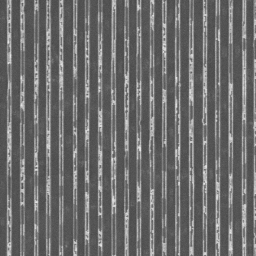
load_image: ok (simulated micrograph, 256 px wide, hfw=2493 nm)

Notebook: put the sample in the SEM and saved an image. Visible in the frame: parallel lines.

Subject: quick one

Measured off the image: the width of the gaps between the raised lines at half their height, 90.1 nm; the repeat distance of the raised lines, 127 nanometers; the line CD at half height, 36.5 nm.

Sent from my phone